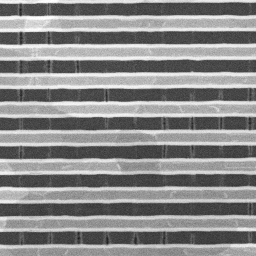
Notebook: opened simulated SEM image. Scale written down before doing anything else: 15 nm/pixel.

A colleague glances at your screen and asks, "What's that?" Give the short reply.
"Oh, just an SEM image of wiring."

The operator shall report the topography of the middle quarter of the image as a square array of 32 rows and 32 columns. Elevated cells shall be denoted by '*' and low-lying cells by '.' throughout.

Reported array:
................................
................................
................................
********************************
********************************
********************************
................................
................................
................................
................................
********************************
********************************
********************************
................................
................................
................................
................................
********************************
********************************
********************************
................................
................................
................................
................................
********************************
********************************
********************************
................................
................................
................................
................................
********************************